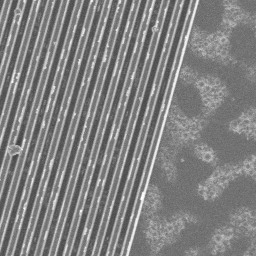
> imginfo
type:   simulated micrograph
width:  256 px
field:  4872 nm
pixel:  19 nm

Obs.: parallel lines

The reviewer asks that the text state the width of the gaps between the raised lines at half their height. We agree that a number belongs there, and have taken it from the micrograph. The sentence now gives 138 nanometers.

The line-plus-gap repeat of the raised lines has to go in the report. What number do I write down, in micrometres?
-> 0.263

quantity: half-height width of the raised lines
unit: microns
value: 0.122